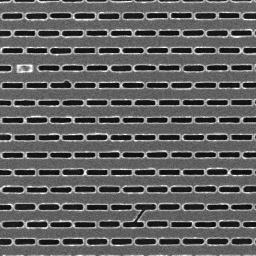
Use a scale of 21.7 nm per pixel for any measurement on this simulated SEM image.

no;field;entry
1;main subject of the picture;a regular array of holes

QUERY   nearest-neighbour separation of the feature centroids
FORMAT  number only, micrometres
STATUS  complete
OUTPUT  0.451